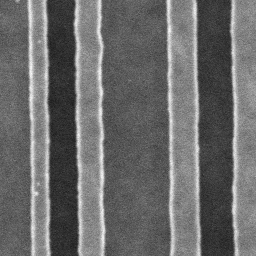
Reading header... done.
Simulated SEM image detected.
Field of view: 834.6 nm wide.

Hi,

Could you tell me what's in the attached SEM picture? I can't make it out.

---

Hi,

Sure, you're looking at lines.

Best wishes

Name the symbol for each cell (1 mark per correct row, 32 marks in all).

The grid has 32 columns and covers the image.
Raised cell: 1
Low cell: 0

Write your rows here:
00001100001100000000011100000111
00001100011100000000011100000111
00001100011110000000011100000111
00001100011100000000011100000111
00001100011110000000011100000111
00001100001110000000011100000111
00001100001110000000011100000111
00001100011110000000011100000111
00001100001110000000011110000111
00001100001110000000011110000111
00001100001110000000011110000111
00001100001110000000011110000111
00001100001110000000011110000111
00001100001110000000011110000111
00001100001110000000011110000111
00001100001110000000011110000111
00001100001110000000011110000111
00001100001110000000011110000111
00001100001110000000011110000111
00001100001110000000011110000111
00001100001110000000011110000111
00001100001110000000011110000111
00001100001110000000011110000111
00001100001110000000011110000111
00001100001110000000011110000111
00001100001110000000011110000111
00001100001110000000011110000111
00001100001110000000011110000111
00001100001110000000011110000111
00001100001110000000001110000111
00001100001110000000001110000111
00001100001110000000011110000111